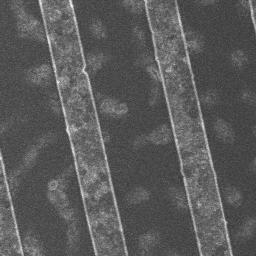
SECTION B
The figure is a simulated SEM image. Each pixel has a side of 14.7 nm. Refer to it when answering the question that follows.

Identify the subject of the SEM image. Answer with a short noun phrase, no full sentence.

one or a few lines or trenches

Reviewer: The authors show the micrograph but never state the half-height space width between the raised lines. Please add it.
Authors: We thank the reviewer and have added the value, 1060 nanometres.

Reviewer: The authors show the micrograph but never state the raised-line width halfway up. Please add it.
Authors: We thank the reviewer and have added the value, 445 nanometres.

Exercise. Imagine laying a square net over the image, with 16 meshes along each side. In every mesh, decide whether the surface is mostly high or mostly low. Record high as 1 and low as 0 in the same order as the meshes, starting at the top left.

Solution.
0001100001100000
0001100001100000
0001100000100000
0001100000110000
0001100000110000
0000110000110000
0000110000110000
0000110000011000
0000110000011000
0000011000011000
0000011000011000
0000011000001100
1000011000001100
1000011000001100
1000001100001100
1000001100001100